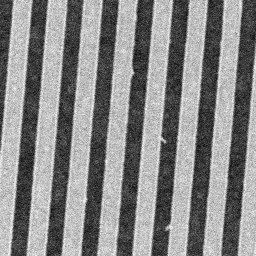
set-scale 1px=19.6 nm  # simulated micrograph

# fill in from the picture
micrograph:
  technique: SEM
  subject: parallel lines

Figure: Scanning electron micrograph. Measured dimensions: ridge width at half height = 17.4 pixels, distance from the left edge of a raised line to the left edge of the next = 687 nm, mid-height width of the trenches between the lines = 0.344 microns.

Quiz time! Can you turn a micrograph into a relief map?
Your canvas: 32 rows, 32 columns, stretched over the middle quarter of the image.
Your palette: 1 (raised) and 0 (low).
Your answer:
00001111000001111000011111000011
00001111000011111000011110000011
00001111000011111000011110000011
00001111000011111000011110000011
00011111000011110000011110000011
00011111000011110000011110000011
00011110000011110000011110000011
00011110000011110000011110000011
00011110000011110000011110000111
00011110000011110000011110000111
00011110000011110000011110000111
00011110000011110000111110000111
00011110000011110000111110000111
00011110000111110000111100000111
00011110000111110000111100000111
00111110000111110000111100000111
00111110000111100000111100000111
00111110000111100000111100000111
00111100000111100000111100000111
00111100000111100000111100000111
00111100000111100000111100001111
00111100000111100000111100001111
00111100000111100001111100001111
00111100000111100001111100001111
00111100000111100001111100001111
00111100001111100001111000001111
00111100001111100001111000001111
01111100001111000001111000001111
01111100001111000001111000001111
01111100001111000001111000001111
01111000001111000001111000001111
01111000001111000001111000001111